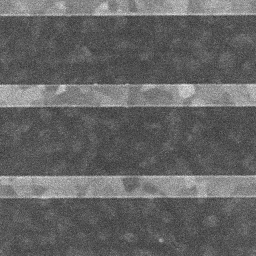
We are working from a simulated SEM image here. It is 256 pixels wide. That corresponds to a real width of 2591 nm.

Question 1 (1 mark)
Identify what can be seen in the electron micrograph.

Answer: one or a few lines or trenches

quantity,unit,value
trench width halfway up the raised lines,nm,711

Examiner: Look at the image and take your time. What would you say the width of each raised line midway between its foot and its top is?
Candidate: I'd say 213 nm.